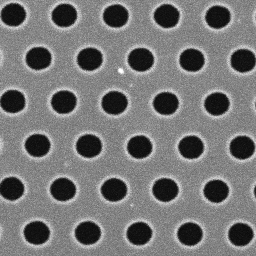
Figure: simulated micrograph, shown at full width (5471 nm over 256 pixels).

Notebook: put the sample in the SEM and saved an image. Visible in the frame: a regular array of holes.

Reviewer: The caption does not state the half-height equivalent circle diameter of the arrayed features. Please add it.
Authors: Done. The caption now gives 546 nm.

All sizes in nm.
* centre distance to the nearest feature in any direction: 1070